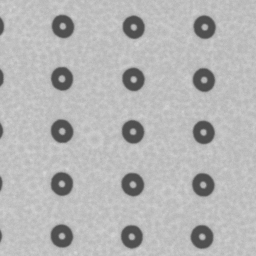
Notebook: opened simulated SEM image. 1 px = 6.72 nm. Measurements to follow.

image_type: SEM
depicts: a regular array of ring-shaped grooves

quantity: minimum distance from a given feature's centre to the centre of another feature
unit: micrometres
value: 0.35